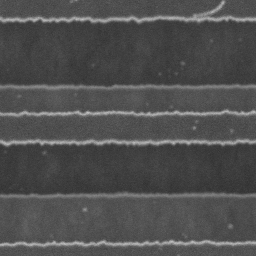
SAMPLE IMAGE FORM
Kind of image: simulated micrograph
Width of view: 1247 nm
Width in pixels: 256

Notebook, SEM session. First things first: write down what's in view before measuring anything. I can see lines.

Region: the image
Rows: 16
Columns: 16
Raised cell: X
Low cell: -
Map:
XXXXXXXXXXXXXXXX
----------------
----------------
----------------
----------------
XXXXXXXXXXXXXXXX
XXXXXXXXXXXXXXXX
XXXXXXXXXXXXXXXX
XXXXXXXXXXXXXXXX
----------------
----------------
----------------
XXXXXXXXXXXXXXXX
XXXXXXXXXXXXXXXX
XXXXXXXXXXXXXXXX
XXXXXXXXXXXXXXXX